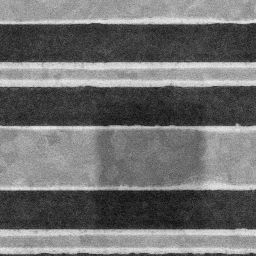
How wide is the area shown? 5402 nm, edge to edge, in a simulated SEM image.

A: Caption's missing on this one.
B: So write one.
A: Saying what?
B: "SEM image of lines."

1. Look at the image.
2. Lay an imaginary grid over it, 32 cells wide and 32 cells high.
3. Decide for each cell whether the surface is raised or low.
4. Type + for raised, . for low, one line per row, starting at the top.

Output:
++++++++++++++++++++++++++++++++
++++++++++++++++++++++++++++++++
++++++++++++++++++++++++++++++++
................................
................................
................................
................................
................................
++++++++++++++++++++++++++++++++
++++++++++++++++++++++++++++++++
+++++++++...+++.+++++.+++++...++
................................
................................
................................
................................
................................
++++++++++++++++++++++++++++++++
++++++++++++++++++++++++++++++++
++++++++++++++++++++++++++++++++
++++++++++++++++++++++++++++++++
++++++++++++++++++++++++++++++++
++++++++++++++++++++++++++++++++
++++++++++++++++++++++++++++++++
++++++++++++++++++++++++++++++++
................................
................................
................................
................................
................................
++++++++++++++++++++++++++++++++
++++++++++++++++++++++++++++++++
................................